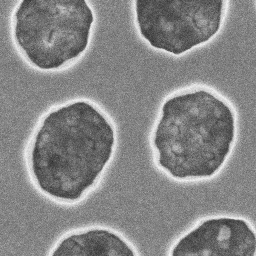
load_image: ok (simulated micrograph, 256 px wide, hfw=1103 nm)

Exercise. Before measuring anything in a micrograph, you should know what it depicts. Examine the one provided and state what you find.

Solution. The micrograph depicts holes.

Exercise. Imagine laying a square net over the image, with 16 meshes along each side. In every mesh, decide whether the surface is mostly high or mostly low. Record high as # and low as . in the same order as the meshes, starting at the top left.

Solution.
#.....###.....##
#.....###.....##
#....####....###
##...###########
################
################
####..####....##
###....###.....#
##.....###.....#
##.....###....##
##....####....##
##....##########
####.###########
################
#####..#####....
####....###.....